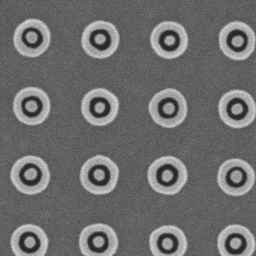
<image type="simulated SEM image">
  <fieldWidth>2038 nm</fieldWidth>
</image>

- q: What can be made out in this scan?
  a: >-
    a regular array of ring-shaped raised bodies with a dot in the middle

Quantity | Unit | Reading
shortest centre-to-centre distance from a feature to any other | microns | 0.538